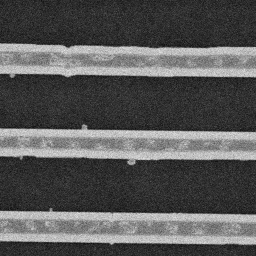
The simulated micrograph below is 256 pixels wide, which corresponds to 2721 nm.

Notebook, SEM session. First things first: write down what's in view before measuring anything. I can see one or a few lines or trenches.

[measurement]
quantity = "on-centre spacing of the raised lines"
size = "83.5 pixels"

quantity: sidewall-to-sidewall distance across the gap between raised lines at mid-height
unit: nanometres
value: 655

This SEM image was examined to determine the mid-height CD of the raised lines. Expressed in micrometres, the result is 0.231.